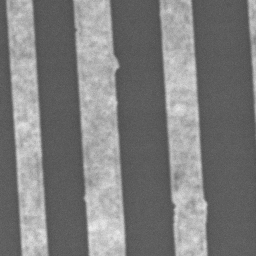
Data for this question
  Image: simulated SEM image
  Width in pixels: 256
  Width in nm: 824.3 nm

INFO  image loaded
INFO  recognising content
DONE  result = one or a few lines or trenches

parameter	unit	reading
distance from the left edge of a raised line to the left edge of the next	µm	0.251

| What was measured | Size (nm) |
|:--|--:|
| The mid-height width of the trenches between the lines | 168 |